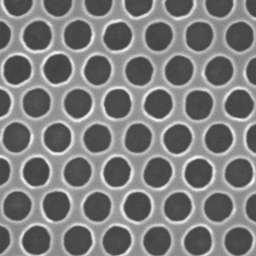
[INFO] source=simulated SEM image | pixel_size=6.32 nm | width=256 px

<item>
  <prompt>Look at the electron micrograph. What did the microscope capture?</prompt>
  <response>a regular array of holes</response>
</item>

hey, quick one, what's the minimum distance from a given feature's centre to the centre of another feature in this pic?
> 39.1 pixels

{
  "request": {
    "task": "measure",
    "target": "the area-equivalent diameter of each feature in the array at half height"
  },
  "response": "184 nanometres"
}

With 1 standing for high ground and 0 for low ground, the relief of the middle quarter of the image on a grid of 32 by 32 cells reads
00111000000011110000001110000000
00111000000011100000001110000000
00111000000011100000001110000000
01111000000111110000001111000000
11111100000111110000011111000001
11111111111111111111111111111111
11000111111100011111111001111111
10000011111000001111100000111110
00000001110000000111100000011100
00000001110000000111000000011100
00000001110000000111000000011100
00000001110000000111000000011100
10000011111000001111100000111110
11001111111110111111111001111111
11111111111111111111111111111111
01111110001111111000011111100011
01111100000111110000011111000000
00111000000011100000001110000000
00111000000011100000001110000000
00111000000011100000001110000000
01111000000111100000011110000001
11111100001111110000011111000001
11111111111111111111111111110111
11100111111100111111110001111111
10000011111000001111100000111110
00000001110000001111100000011110
00000001110000000111000000011100
00000001110000000111000000011100
00000001110000001111000000011100
10000011110000001111000000111110
11001111111100111111100001111111
11111111111111111111111111111111